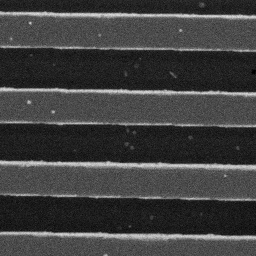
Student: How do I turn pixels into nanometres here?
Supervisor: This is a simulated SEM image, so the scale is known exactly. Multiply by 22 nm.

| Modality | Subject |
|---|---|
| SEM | lines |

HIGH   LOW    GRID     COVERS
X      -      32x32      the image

--------------------------------
--------------------------------
XXXXXXXXXXXXXXXXXXXXXXXXXXXXXXXX
XXXXXXXXXXXXXXXXXXXXXXXXXXXXXXXX
XXXXXXXXXXXXXXXXXXXXXXXXXXXXXXXX
XXXXXXXXXXXXXXXXXXXXXXXXXXXXXXXX
--------------------------------
--------------------------------
--------------------------------
--------------------------------
--------------------------------
XXXXXXXXXXXXXXXXXXXXXX----------
XXXXXXXXXXXXXXXXXXXXXXXXXXXXXXXX
XXXXXXXXXXXXXXXXXXXXXXXXXXXXXXXX
XXXXXXXXXXXXXXXXXXXXXXXXXXXXXXXX
---------------XXXXXXXXXXXXXXXXX
--------------------------------
--------------------------------
--------------------------------
--------------------------------
XXXXXXXXXXXXXXXXXXXXX-----------
XXXXXXXXXXXXXXXXXXXXXXXXXXXXXXXX
XXXXXXXXXXXXXXXXXXXXXXXXXXXXXXXX
XXXXXXXXXXXXXXXXXXXXXXXXXXXXXXXX
------XXXXXXXXXXXXXXXXXXXXXXXXXX
--------------------------------
--------------------------------
--------------------------------
--------------------------------
XXXXXXXXXXXXXXXXXXXXXXXXXXX-----
XXXXXXXXXXXXXXXXXXXXXXXXXXXXXXXX
XXXXXXXXXXXXXXXXXXXXXXXXXXXXXXXX